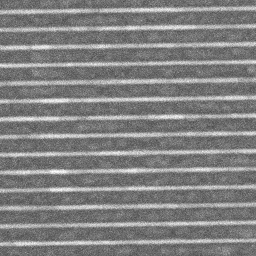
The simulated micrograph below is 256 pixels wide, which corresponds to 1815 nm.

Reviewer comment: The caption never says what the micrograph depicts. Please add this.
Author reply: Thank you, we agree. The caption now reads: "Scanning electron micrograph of parallel lines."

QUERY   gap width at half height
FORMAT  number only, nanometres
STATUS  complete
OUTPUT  106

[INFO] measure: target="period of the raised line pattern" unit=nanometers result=127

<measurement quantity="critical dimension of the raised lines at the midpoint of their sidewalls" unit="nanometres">22.2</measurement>